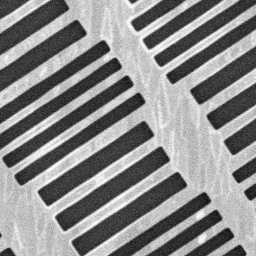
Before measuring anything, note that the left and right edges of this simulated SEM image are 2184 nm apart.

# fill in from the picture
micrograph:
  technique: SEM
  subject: groups of lines, slits or small figures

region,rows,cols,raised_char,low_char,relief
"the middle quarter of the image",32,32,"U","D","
DDDDDDUUUDDDDDDUUUUUUUUDDUUUDDDD
DDDDUUUUDDDDDDUUUUUUUUUUUUUDDDDD
DDDUUUDDDDDDUUUUUUUUUUUUUDDDDDDD
DUUUUDDDDDDUUUDDDUUUUUUUUUDDDDUU
UUUDDDDDDUUUUDDDDUUUUUUUUUDDDUUU
UUDDDDDDUUUDDDDDDUUUUUUUUUUUUUUU
DDDDDDUUUUDDDDDDUUUUUUUUUUUUUUUD
DDDDDUUUDDDDDDUUUUDUUUUUUUUUUUUU
DDDUUUUDDDDDDUUUDDDDUUUUUUUUUUUU
DDUUUDDDDDDDUUUDDDDDDUUUUUUUUUUU
UUUUDDDDDDUUUDDDDDDUUUUUUUUUUUUU
UUDDDDDDDUUUDDDDDDUUUUUUUUUUUUUU
UDDDDDDUUUDDDDDDDUUUUUUUUUUUUUUU
DDDDDUUUUDDDDDDUUUUUUUUUUUUUUUUU
DDDDUUUDDDDDDDUUUUUDUUUUUUUUUUUU
DDUUUUDDDDDDUUUUUUDDDUUUUUUUUUUU
DUUUDDDDDDDUUUUUDDDDDDUUUUUUUUUU
UUUDDDDDDUUUUUUDDDDDDDDUUUUUUUUU
UDDDDDDDUUUUUDDDDDDDDDUUUUUUUUUU
DDDDDDUUUUUUDDDDDDDDDUUUUUUUUUUU
DDDDDUUUUUDDDDDDDDDUUUUUUUUUUUUU
DDDUUUUUDDDDDDDDDDUUUUDDDUUUUUUU
DDUUUUUDDDDDDDDDUUUUUDDDDDUUUUUU
UUUUUDDDDDDDDDDUUUUDDDDDDDUUUUUU
UUUUDDDDDDDDDUUUUUDDDDDDDDUUUUUU
UUDDDDDDDDDDUUUUDDDDDDDDDUUUUUUU
DDDDDDDDDDUUUUDDDDDDDDDDUUUUUUUU
DDDDDDDDDUUUUDDDDDDDDDUUUUUDDUUU
DDDDDDDDUUUDDDDDDDDDDUUUUDDDDDUU
DDDDDDUUUUDDDDDDDDDUUUUUDDDDDDDU
DDDDUUUUDDDDDDDDDDUUUUDDDDDDDDDU
DDDUUUUDDDDDDDDDDUUUDDDDDDDDDDUU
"